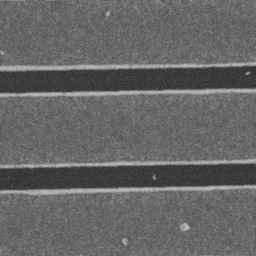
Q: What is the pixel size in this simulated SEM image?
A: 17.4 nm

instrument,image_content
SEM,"lines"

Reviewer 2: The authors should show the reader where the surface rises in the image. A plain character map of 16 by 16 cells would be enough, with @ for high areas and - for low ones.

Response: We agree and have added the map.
@@@@@@@@@@@@@@@@
@@@@@@@@@@@@@@@@
@@@@@@@@@@@@@@@@
@@@@@@@@@@@@@@@@
----------------
----------------
@@@@@@@@@@@@@@@@
@@@@@@@@@@@@@@@@
@@@@@@@@@@@@@@@@
@@@@@@@@@@@@@@@@
----------------
----------------
@@@@@@@@@@@@@@@@
@@@@@@@@@@@@@@@@
@@@@@@@@@@@@@@@@
@@@@@@@@@@@@@@@@